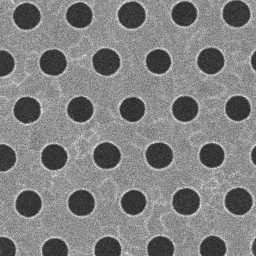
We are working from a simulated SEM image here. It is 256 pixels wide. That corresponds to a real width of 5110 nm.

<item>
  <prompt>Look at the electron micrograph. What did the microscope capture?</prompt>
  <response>a regular array of holes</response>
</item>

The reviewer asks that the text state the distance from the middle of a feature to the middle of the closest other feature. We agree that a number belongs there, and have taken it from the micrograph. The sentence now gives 1050 nanometers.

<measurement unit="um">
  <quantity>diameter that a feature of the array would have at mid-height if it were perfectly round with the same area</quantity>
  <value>0.543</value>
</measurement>